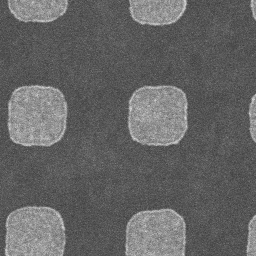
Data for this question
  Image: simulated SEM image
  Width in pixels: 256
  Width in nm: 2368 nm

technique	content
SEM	raised bodies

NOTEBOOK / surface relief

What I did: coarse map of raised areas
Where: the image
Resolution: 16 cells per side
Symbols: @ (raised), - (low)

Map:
-@@@----@@@@----
---------@------
----------------
----------------
----------------
-@@------@@-----
-@@@----@@@@----
-@@@----@@@@----
-@@@----@@@-----
----------------
----------------
----------------
----------------
-@@@----@@@-----
@@@@----@@@@----
@@@@----@@@@---@